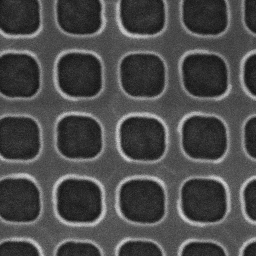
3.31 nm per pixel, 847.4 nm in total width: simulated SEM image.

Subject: a regular array of holes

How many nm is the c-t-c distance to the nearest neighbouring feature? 206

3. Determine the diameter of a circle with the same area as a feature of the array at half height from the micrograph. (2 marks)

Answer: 0.161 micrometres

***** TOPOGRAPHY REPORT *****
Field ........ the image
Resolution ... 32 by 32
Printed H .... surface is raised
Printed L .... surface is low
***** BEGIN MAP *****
LLLLLHHLLLLLLHHLLLLLLHHLLLLLHHLL
LLLLLHHLLLLLLHHLLLLLLHHLLLLLLHLL
LLLLLHHLLLLLLHHLLLLLLHHLLLLLLHLL
LLLLLHHHLLLLLHHLLLLLHHHLLLLLHHHL
HHHHHHHHHHHHHHHHHHHHHHHHHHLHHHHH
HHHHHHHHHHHHHHHHHHHHHHHHHHHHHHHH
HHHHHHHHHHHHHHHHHHHHHHHHHHHHHHHH
LLLLHHHLLLLLHHHLLLLLHHHLLLLLHHHL
LLLLLHHLLLLLLHHLLLLLLHHLLLLLHHLL
LLLLLHHLLLLLLHHLLLLLLHHLLLLLLHLL
LLLLLHHLLLLLLHHLLLLLLHHLLLLLLHHL
LLLLLHHHLLLLLHHHLLLLHHHLLLLLHHHL
HHHHHHHHHHHHHHHHHHHHHHHHHHHHHHHH
HHHHHHHHHHHHHHHHHHHHHHHHHHHHHHHH
HLLHHHHHLLLHHHHHHLHHHHHHLLHHHHHH
LLLLLHHLLLLLHHHLLLLLHHHLLLLLHHHL
LLLLLHHLLLLLLHHLLLLLLHHLLLLLHHLL
LLLLLHHLLLLLLHHLLLLLLHHLLLLLLHLL
LLLLLHHLLLLLLHHLLLLLLHHLLLLLHHHL
LLLLLHHHLLLLHHHHLLLLHHHLLLLLHHHL
HHHHHHHHHHHHHHHHHHHHHHHHHHHHHHHH
HHHHHHHHHHHHHHHHHHHHHHHHHHHHHHHH
LLLLHHHHLLLHHHHHLLLHHHHLLLLHHHHL
LLLLLHHLLLLLLHHLLLLLHHHLLLLLHHHL
LLLLLHHLLLLLLHHLLLLLLHLLLLLLHHLL
LLLLLHHLLLLLLHHLLLLLLHHLLLLLHHHL
LLLLLHHLLLLLLHHLLLLLLHHLLLLLHHHL
LLLLHHHHLLLLHHHHLLLLHHHHLLLLHHHL
HHHHHHHHHHHHHHHHHHHHHHHHHHHHHHHH
HHHHHHHHHHHHHHHHHHHHHHHHHHHHHHHH
LLLLHHHHLLLLHHHLLLLLHHHLLLLHHHHL
LLLLLHHLLLLLLHHLLLLLHHHLLLLLHHLL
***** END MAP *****